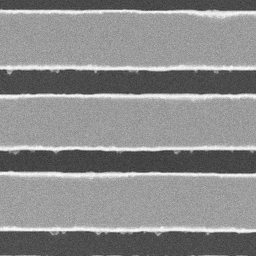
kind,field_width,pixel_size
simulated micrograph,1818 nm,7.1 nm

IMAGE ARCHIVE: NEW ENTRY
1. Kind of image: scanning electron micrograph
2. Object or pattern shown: lines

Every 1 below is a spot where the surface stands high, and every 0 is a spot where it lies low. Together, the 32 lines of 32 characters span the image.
00000000000000000000000000000000
11111111111111111111111111111111
11111111111111111111111111111111
11111111111111111111111111111111
11111111111111111111111111111111
11111111111111111111111111111111
11111111111111111111111111111111
11111111111111111111111111111111
11111111111111111111111111111111
00000000000000000000000000000000
00000000000000000000000000000000
00000000000000000000000000000000
11111111111111111111111111111111
11111111111111111111111111111111
11111111111111111111111111111111
11111111111111111111111111111111
11111111111111111111111111111111
11111111111111111111111111111111
11111111111111111111111111111111
00000000000000000000000000000000
00000000000000000000000000000000
00000000000000000000000000000000
11111111111111111111111111111111
11111111111111111111111111111111
11111111111111111111111111111111
11111111111111111111111111111111
11111111111111111111111111111111
11111111111111111111111111111111
11111111111111111111111111111111
00000000000000000000000000000000
00000000000000000000000000000000
00000000000000000000000000000000